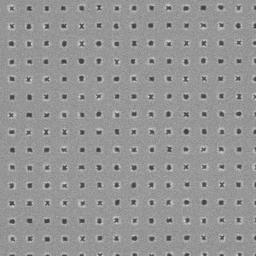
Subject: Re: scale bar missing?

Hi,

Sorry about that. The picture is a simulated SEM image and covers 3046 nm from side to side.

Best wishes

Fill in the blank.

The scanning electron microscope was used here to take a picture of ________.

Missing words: a regular array of holes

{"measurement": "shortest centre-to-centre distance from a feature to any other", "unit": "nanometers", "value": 202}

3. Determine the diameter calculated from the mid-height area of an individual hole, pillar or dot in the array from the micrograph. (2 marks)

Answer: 73.5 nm